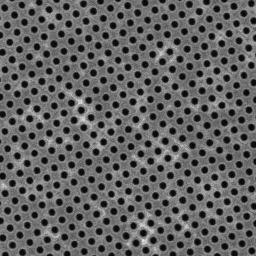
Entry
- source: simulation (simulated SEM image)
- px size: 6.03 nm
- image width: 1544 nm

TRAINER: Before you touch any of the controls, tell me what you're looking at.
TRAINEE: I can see a regular array of holes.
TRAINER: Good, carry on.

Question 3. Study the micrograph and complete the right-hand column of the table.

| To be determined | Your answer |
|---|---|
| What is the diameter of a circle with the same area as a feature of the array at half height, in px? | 7.05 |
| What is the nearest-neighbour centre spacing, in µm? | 0.0731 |